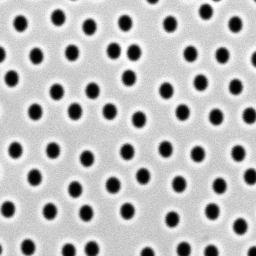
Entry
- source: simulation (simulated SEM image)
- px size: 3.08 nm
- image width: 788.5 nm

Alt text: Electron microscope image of a regular array of holes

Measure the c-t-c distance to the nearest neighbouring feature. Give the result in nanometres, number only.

95.2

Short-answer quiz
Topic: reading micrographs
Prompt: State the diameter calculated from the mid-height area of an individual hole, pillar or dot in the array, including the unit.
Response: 48.3 nm